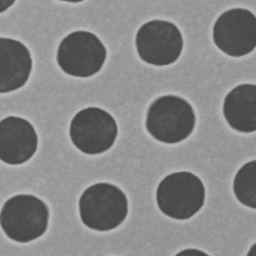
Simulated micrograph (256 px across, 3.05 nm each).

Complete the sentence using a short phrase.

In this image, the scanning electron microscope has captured holes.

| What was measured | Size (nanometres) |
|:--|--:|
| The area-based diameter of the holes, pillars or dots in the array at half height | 146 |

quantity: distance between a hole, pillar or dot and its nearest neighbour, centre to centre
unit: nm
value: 234